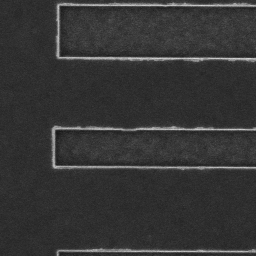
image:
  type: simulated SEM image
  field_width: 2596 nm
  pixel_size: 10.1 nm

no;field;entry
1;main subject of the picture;one or a few lines or trenches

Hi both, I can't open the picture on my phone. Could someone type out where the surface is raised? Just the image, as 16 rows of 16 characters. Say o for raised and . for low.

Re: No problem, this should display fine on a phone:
oooo............
oooo............
oooo............
oooo............
oooooooooooooooo
oooooooooooooooo
oooooooooooooooo
oooooooooooooooo
ooo.............
ooo.............
oooooooooooooo..
oooooooooooooooo
oooooooooooooooo
oooooooooooooooo
oooooooooooooooo
oooooooooooooooo